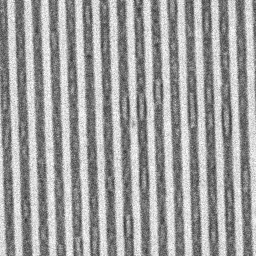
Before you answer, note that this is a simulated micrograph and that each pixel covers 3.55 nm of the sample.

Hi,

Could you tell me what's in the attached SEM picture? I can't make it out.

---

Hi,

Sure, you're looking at parallel lines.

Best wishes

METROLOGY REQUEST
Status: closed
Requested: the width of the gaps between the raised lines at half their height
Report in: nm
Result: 36.4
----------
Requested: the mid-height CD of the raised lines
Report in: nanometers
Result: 24.4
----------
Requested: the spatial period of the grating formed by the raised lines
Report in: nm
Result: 60.2